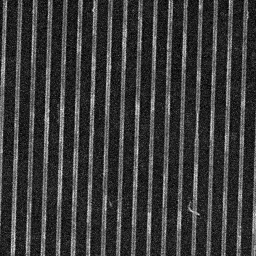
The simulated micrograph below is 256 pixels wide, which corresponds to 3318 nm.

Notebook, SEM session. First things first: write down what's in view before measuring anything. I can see parallel lines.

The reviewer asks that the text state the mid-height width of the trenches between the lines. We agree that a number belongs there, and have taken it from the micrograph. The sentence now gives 155 nanometres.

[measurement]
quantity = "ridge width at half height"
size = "37.2 nm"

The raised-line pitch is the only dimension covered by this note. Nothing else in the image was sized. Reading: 195 nanometres